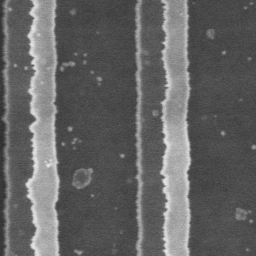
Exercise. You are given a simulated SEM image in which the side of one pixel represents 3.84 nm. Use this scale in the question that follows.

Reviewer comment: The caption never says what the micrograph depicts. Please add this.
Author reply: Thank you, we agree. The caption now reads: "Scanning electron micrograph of lines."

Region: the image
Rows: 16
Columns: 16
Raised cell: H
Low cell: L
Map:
HHHLLLLLLHHHLLLL
HHHLLLLLLHHHLLLL
HHHLLLLLLHHHLLLL
HHHHLLLLLHHHLLLL
HHHLLLLLLHHHLLLL
HHHLLLLLLHHHLLLL
HHHLLLLLLHHHLLLL
HHHLLLLLLHHHLLLL
HHHLLLLLLHHHLLLL
HHHLLLLLLHHHLLLL
HHHHLLLLLHHHLLLL
HHHHLLLLLHHHLLLL
HHHHLLLLLHHHLLLL
HHHHLLLLLHHHLLLL
HHHHLLLLLHHHLLLL
HHHHLLLLLHHHLLLL